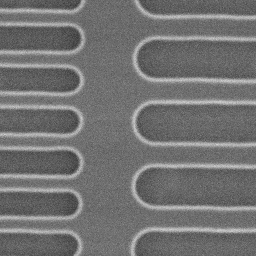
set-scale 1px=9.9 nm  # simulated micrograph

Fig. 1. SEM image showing groups of lines, slits or small figures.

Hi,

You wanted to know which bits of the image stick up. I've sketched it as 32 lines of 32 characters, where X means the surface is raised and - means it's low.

----------XXXXXXX---------------
XXXXXXXXXXXXXXXXXX--------------
XXXXXXXXXXXXXXXXXXXXXXXXXXXXXXXX
---------XXXXXXXXXXXXXXXXXXXXXXX
----------XXXXXXXXXXXXXXXXXXXXXX
----------XXXXXXXX--------------
XXXXXXX-XXXXXXXXX---------------
XXXXXXXXXXXXXXXXX---------------
---------XXXXXXXX---------------
----------XXXXXXXX--------------
----------XXXXXXXXXXXXXXXXXXXXXX
---------XXXXXXXXXXXXXXXXXXXXXXX
XXXXXXXXXXXXXXXXXXXXXXXXXXXXXXXX
-------XXXXXXXXXXX--------------
----------XXXXXXX---------------
----------XXXXXXX---------------
---------XXXXXXXX---------------
XXXXXXXXXXXXXXXXXX--------------
XXXXXXXXXXXXXXXXXXXXXXXXXXXXXXXX
----------XXXXXXXXXXXXXXXXXXXXXX
----------XXXXXXXXXXXXXXXXXXXXXX
----------XXXXXXXX--------------
XXXXXXXXXXXXXXXXX---------------
XXXXXXXXXXXXXXXXX---------------
----------XXXXXXX---------------
----------XXXXXXXX--------------
----------XXXXXXXXXXXXXXXXXXXXXX
XXXXXXXXXXXXXXXXXXXXXXXXXXXXXXXX
XXXXXXXXXXXXXXXXXXXXXXXXXXXXXXXX
---------XXXXXXXX---------------
----------XXXXXXX---------------
----------XXXXXXX---------------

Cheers